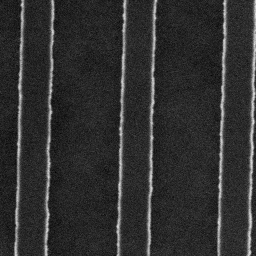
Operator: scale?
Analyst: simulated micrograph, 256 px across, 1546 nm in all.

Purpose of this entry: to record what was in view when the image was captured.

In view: lines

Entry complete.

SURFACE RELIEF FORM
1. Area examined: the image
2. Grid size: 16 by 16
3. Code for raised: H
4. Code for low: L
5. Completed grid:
LHHLLLLLHHLLLLHH
LHHLLLLLHHLLLLHH
LHHLLLLLHHLLLLHH
LHHLLLLLHHLLLLHH
LHHLLLLLHHLLLLHH
LHHLLLLLHHLLLLHH
LHHLLLLLHHLLLLHH
LHHLLLLLHHLLLLHH
LHHLLLLHHLLLLLHH
LHHLLLLHHLLLLLHH
LHHLLLLHHLLLLLHH
LHHLLLLHHLLLLLHH
LHHLLLLHHLLLLLHH
LHHLLLLHHLLLLLHH
LHHLLLLHHLLLLLHH
LHHLLLLHHLLLLLHH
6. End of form